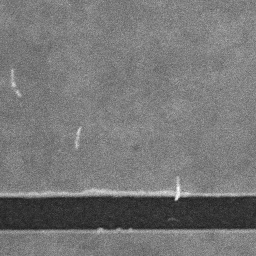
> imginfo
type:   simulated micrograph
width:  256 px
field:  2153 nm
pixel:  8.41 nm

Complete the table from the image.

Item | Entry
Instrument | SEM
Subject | one or a few lines or trenches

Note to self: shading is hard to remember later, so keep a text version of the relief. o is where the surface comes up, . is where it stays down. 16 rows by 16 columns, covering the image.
oooooooooooooooo
oooooooooooooooo
oooooooooooooooo
oooooooooooooooo
oooooooooooooooo
oooooooooooooooo
oooooooooooooooo
oooooooooooooooo
oooooooooooooooo
oooooooooooooooo
oooooooooooooooo
oooooooooooooooo
................
................
oooooooooooooooo
oooooooooooooooo